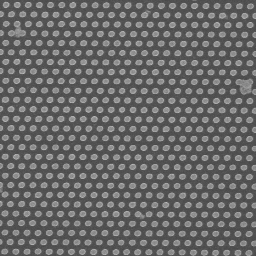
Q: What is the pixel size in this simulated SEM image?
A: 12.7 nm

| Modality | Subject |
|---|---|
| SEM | a regular array of raised bodies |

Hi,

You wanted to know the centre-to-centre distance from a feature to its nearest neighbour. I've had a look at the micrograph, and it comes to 134 nm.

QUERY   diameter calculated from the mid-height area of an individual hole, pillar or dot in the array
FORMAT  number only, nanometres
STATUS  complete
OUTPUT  78.4